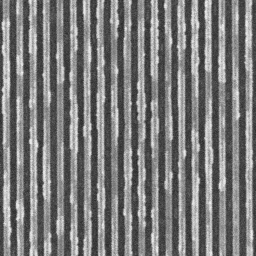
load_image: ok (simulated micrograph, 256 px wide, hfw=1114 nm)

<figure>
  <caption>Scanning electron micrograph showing parallel lines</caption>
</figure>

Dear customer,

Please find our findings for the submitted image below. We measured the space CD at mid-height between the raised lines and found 33.7 nanometres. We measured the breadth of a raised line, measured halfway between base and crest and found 25 nanometers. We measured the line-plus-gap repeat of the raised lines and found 58.6 nm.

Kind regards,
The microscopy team